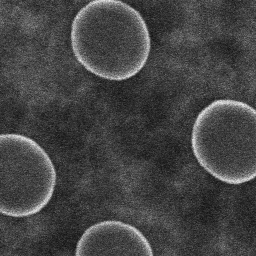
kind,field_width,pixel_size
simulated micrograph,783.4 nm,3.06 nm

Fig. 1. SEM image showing raised bodies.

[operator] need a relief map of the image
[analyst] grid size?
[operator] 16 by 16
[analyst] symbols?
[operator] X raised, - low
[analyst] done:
-----XXX--------
-----XXXX-------
----XXXXX-------
-----XXXX-------
------XX--------
----------------
-------------XX-
------------XXXX
X-----------XXXX
XXX---------XXXX
XXX----------XXX
XXX-------------
XXX-------------
----------------
-----XXXX-------
-----XXXX-------